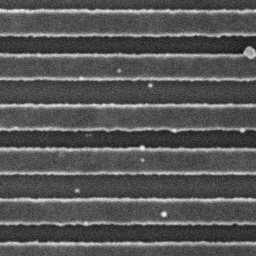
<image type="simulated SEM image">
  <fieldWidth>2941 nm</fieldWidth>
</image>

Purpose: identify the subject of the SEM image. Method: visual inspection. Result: lines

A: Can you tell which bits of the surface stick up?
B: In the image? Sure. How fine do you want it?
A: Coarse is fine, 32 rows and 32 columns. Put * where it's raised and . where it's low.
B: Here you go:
................................
********************************
********************************
********************************
...................*......*.....
................................
..............................**
********************************
********************************
********************************
................................
................................
................................
********************************
********************************
********************************
................................
................................
******....**.*..***.*......*....
********************************
********************************
********************************
................................
................................
................................
********************************
********************************
********************************
................................
................................
********************************
********************************